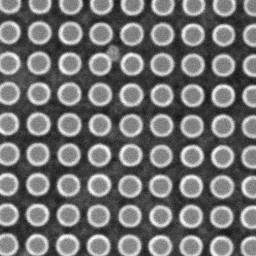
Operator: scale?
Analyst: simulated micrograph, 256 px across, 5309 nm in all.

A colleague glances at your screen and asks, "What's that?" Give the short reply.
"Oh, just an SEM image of a regular array of raised bodies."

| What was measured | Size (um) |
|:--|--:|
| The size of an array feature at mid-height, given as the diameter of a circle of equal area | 0.442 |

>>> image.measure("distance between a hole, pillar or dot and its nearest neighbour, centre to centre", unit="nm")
624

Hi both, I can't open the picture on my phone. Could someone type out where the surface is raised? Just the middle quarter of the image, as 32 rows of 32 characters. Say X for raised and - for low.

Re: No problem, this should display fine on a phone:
XXXX---XXXXX--XXXXX---XXXXX---XX
XXXX---XXXX----XXXX---XXXXX---XX
---------X------XX-----XXX-----X
--------------------------------
--------------------------------
XXX-----XX------XX-----XX------X
XXXX---XXXX----XXXX---XXXXX---XX
XXXX--XXXXXX--XXXXX---XXXXX---XX
XXXX---XXXX---XXXXX---XXXXX---XX
XXX----XXXX----XXXX----XXXX---XX
--------------------------------
--------------------------------
--------------------------------
XXXX---XXXX----XXXX----XXX----XX
XXXX---XXXX---XXXXX---XXXXX---XX
XXXX---XXXX---XXXXX---XXXXX--XXX
XXXX---XXXX---XXXXX---XXXXX---XX
XXX-----XX-----XXX-----XXX----XX
--------------------------------
--------------------------------
XXX-----XX------XX------X-------
XXXX---XXXX----XXXX---XXXX----XX
XXXX--XXXXXX--XXXXX---XXXXX--XXX
XXXX--XXXXX---XXXXX---XXXXX--XXX
XXX----XXXX----XXXX---XXXX----XX
-----------------------XX-------
--------------------------------
--------------------------------
XXX----XXXX----XXX-----XXX-----X
XXXX--XXXXX---XXXXX---XXXXX---XX
XXXX--XXXXX---XXXXX---XXXXX--XXX
XXX---XXXXX---XXXXX---XXXXX--XXX